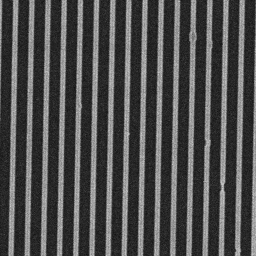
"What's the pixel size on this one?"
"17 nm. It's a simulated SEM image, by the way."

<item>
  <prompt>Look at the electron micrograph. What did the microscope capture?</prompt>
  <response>parallel lines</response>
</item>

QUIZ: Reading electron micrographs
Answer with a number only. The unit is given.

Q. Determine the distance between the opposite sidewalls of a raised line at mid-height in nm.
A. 63.8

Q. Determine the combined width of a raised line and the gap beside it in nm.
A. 275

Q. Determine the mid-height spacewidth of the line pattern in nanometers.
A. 208